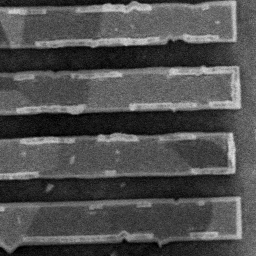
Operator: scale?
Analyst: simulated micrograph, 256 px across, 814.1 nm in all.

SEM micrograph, one or a few lines or trenches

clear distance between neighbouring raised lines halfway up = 26.3 pixels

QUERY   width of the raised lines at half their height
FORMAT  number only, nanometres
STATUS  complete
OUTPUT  124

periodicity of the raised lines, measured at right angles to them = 209 nm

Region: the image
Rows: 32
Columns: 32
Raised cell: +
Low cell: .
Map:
.............+..++.........++...
+++++++++++++++++++++++++++++...
+++++++++++++++++++++++++++++...
+++++++++++++++++++++++++++++...
+++++++++++++++++++++++++++++...
++++++++++++++.+++..............
................................
................................
.........................+++++..
++++++++++++++++++++++++++++++..
++++++++++++++++++++++++++++++..
++++++++++++++++++++++++++++++..
++++++++++++++++++++++++++++++..
+++++++++++++++++++++++.........
................................
................................
................................
..+++++++++++++++++++++++++++...
+++++++++++++++++++++++++++++...
+++++++++++++++++++++++++++++...
+++++++++++++++++++++++++++++...
+++++++++++++++++++++++++++++...
................................
................................
................................
...........+++++++++++++++++++..
++++++++++++++++++++++++++++++..
++++++++++++++++++++++++++++++..
++++++++++++++++++++++++++++++..
+++++++++++++++++++++++++++++...
++..............................
................................